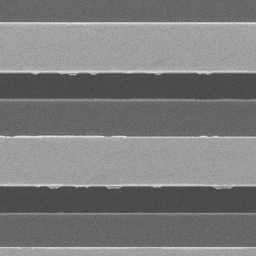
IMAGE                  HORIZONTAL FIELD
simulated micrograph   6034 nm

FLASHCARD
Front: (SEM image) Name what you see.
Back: lines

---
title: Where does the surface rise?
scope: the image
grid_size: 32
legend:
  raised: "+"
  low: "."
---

++++++++++++++++++++++++++++++++
++++++++++++++++++++++++++++++++
++++++++++++++++++++++++++++++++
++++++++++++++++++++++++++++++++
++++++++++++++++++++++++++++++++
++++++++++++++++++++++++++++++++
++++++++++++++++++++++++++++++++
++++++++++++++++++++++++++++++++
++++++++++++++++++++++++++++++++
................................
................................
................................
................................
++++++++++++++++++++++++++++++++
++++++++++++++++++++++++++++++++
++++++++++++++++++++++++++++++++
++++++++++++++++++++++++++++++++
++++++++++++++++++++++++++++++++
++++++++++++++++++++++++++++++++
++++++++++++++++++++++++++++++++
++++++++++++++++++++++++++++++++
++++++++++++++++++++++++++++++++
++++++++++++++++++++++++++++++++
......+.......+............++...
................................
................................
................................
++++++++++++++++++++++++++++++++
++++++++++++++++++++++++++++++++
++++++++++++++++++++++++++++++++
++++++++++++++++++++++++++++++++
++++++++++++++++++++++++++++++++